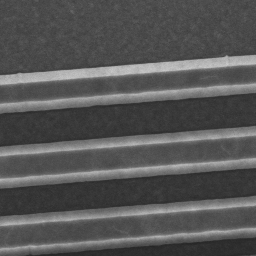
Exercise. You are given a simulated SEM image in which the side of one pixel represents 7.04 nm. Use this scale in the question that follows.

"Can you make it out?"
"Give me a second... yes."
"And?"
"one or a few lines or trenches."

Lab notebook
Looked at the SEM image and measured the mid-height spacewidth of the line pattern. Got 270 nanometres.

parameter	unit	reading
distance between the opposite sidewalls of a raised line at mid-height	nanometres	237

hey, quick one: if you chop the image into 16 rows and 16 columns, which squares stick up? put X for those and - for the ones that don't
----------------
----------------
----------------
----------------
------XXXXXXXXXX
XXXXXXXXXXXXXXXX
XXXX------------
----------------
-----------XXXXX
XXXXXXXXXXXXXXXX
XXXXXXXXXXXXX---
X---------------
----------------
---XXXXXXXXXXXXX
XXXXXXXXXXXXXXXX
XXXXX-----------